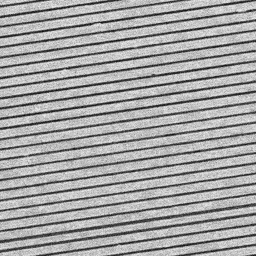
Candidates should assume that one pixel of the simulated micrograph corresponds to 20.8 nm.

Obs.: parallel lines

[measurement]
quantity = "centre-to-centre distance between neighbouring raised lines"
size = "210 nm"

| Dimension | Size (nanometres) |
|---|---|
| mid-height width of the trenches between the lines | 54.1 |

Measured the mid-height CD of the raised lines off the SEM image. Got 147 nm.